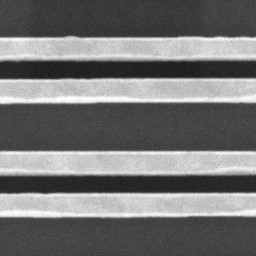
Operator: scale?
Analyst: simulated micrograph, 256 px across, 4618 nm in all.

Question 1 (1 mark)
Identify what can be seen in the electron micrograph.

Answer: lines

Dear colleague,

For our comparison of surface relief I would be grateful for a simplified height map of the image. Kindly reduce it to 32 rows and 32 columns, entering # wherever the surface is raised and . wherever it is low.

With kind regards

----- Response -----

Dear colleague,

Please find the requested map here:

................................
................................
................................
................................
................................
################################
################################
................................
................................
................................
################################
################################
.######.........########........
................................
................................
................................
................................
................................
................................
################################
################################
###########################.....
................................
................................
################################
################################
################################
................................
................................
................................
................................
................................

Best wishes